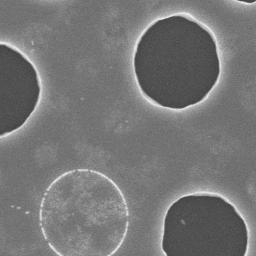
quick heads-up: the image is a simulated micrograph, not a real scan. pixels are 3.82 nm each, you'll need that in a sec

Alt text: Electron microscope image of holes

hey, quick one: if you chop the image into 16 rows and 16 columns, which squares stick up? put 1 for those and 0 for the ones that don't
1111111111111111
1111111111000111
1111111110000111
0111111100000011
0011111100000011
0001111110000111
0011111111001111
0011111111111111
1111111111111111
1111111111111111
1111111111111111
1111111111111111
1111111111100011
1111111111000001
1111111111000001
1111111111000001